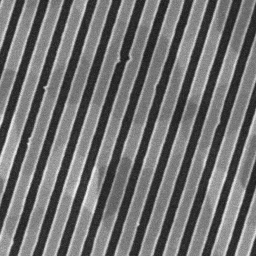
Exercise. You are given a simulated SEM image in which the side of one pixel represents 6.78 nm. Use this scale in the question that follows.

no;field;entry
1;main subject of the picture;parallel lines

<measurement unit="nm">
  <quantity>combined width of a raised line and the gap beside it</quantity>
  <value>156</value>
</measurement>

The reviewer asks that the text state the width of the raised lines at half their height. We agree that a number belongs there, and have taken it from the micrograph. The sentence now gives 87.4 nm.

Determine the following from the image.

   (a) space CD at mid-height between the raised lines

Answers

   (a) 68 nm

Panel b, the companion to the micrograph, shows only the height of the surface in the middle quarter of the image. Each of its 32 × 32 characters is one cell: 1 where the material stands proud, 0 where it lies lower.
10001110001110011110011110001110
00011100011110011110011110011110
00011100011100011100011100011100
00111100011100011100011100111100
00111100111000111000111100111100
00111000111000111000111000111000
00111000111000111000111000111000
01111001111001110001111001111001
01110001110001110001110001110001
11110001110001110001110001110001
11110011110011110011110011110011
11100011100011100011100011100011
11100011100011100011100011100011
11100111100111100111100011100011
11000111100111000111100111100111
11000111000111000111000111000111
11000111000111001111001111000111
11001111001111001111001111001111
10001110001110001110001110001110
10001110001110011110011110001110
10011110011100011110011110011110
00011100011100011100011100011100
00011100011100111100011100011100
00111100111100111100111100111100
00111000111000111000111000111000
00111000111000111000111000111000
01111001111001111001111001111001
01110001110001110001110001111001
01110001110001110001110001110001
11110011110011110011110001110001
11100011100011110011110011110011
11100011100011100011100011100011